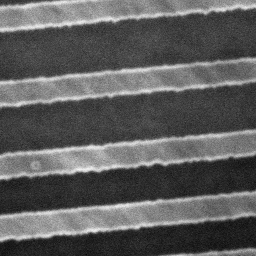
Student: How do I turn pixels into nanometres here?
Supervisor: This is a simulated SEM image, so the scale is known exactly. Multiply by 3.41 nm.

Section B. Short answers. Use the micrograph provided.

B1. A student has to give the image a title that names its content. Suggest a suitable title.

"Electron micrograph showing lines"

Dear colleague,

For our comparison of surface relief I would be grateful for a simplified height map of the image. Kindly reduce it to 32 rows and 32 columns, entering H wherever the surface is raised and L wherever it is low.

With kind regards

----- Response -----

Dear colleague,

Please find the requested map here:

LLLLHHHHHHHHHHHHHHHHHHHHHHHHHHHH
HHHHHHHHHHHHHHHHHHHHHHHHHHLLLLLL
HHHHHHHHHHHHHHHLLLLLLLLLLLLLLLLL
HHHHHLLLLLLLLLLLLLLLLLLLLLLLLLLL
LLLLLLLLLLLLLLLLLLLLLLLLLLLLLLLL
LLLLLLLLLLLLLLLLLLLLLLLLLLLLLLLL
LLLLLLLLLLLLLLLLLLLLLLLLLLLLLLLL
LLLLLLLLLLLLLLLLLLLLLLLLLLLLLHHH
LLLLLLLLLLLLLLLLLLHHHHHHHHHHHHHH
LLLLLLLLHHHHHHHHHHHHHHHHHHHHHHHH
HHHHHHHHHHHHHHHHHHHHHHHHHHHHHHLL
HHHHHHHHHHHHHHHHHHHLLLLLLLLLLLLL
HHHHHHHHLLLLLLLLLLLLLLLLLLLLLLLL
LLLLLLLLLLLLLLLLLLLLLLLLLLLLLLLL
LLLLLLLLLLLLLLLLLLLLLLLLLLLLLLLL
LLLLLLLLLLLLLLLLLLLLLLLLLLLLLLLL
LLLLLLLLLLLLLLLLLLLLLLLLLLLLLLHH
LLLLLLLLLLLLLLLLLLLLHHHHHHHHHHHH
LLLLLLLLLLHHHHHHHHHHHHHHHHHHHHHH
HHHHHHHHHHHHHHHHHHHHHHHHHHHHHHHL
HHHHHHHHHHHHHHHHHHHLHLLLLLLLLLLL
HHHHHHHHHLLLLLLLLLLLLLLLLLLLLLLL
LLLLLLLLLLLLLLLLLLLLLLLLLLLLLLLL
LLLLLLLLLLLLLLLLLLLLLLLLLLLLLLLL
LLLLLLLLLLLLLLLLLLLLLLLLLHHHHHHH
LLLLLLLLLLLLLLLHHHHHHHHHHHHHHHHH
LLLLLHHHHHHHHHHHHHHHHHHHHHHHHHHH
HHHHHHHHHHHHHHHHHHHHHHHHHHHLLLLL
HHHHHHHHHHHHHHHHHLLLLLLLLLLLLLLL
HHHHHHLLLLLLLLLLLLLLLLLLLLLLLLLL
LLLLLLLLLLLLLLLLLLLLLLLLLLLLLLLL
LLLLLLLLLLLLLLLLLLLLLLLLLLHHHHHH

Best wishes